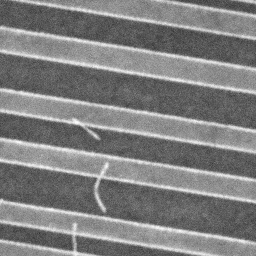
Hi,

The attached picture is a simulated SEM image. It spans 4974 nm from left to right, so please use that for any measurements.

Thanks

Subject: lines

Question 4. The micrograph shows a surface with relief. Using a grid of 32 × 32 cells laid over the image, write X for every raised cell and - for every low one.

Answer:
-----XXXXXXXXXXXXXXXXXX---------
-----------XXXXXXXXXXXXXXXXXX---
-----------------XXXXXXXXXXXXXXX
------------------------XXXXXXXX
XXXXXXX----------------------XXX
XXXXXXXXXXXXX-------------------
XXXXXXXXXXXXXXXXXXX-------------
-------XXXXXXXXXXXXXXXXXX-------
------------XXXXXXXXXXXXXXXXXXX-
------------------XXXXXXXXXXXXXX
-------------------------XXXXXXX
XX-----------------------------X
XXXXXXXX------------------------
XXXXXXXXXXXXXXX-----------------
----XXXXXXXXXXXXXXXXX-----------
----------XXXXXXXXXXXXXXXXX-----
----------------XXXXXXXXXXXXXXXX
X---------------------XXXXXXXXXX
XXXXXXX----------------------XXX
XXXXXXXXXXXXX-------------------
--XXXXXXXXXXXXXXXXXX------------
--------XXXXXXXXXXXXXXXXXX------
---------------XXXXXXXXXXXXXXXXX
---------------------XXXXXXXXXXX
---------------------------XXXXX
XX------------------------------
XXXXXXXXX-----------------------
XXXXXXXXXXXXXX------------------
----XXXXXXXXXXXXXXXX------------
-----------XXXXXXXXXXXXXXXX-----
XXX--------------XXXXXXXXXXXXXXX
XXXXXXXXXX-------------XXXXXXXXX